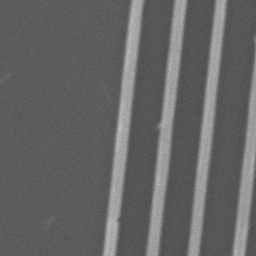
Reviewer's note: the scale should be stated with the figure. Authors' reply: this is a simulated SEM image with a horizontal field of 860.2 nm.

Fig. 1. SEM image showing parallel lines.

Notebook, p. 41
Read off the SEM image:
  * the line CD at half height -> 37.6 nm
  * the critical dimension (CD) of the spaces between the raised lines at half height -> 107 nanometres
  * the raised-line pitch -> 142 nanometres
